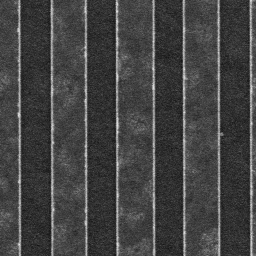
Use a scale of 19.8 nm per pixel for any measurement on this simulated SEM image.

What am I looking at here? one or a few lines or trenches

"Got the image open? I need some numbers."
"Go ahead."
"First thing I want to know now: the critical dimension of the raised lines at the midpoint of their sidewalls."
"0.69 microns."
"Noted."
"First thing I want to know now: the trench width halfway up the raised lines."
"626 nm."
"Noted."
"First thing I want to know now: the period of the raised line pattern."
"1310 nm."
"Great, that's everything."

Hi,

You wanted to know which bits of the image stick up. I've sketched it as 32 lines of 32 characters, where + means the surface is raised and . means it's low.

++.....++++....++++....++++....+
++.....++++....++++....++++....+
++.....++++....++++....++++....+
++.....++++....++++....++++....+
++.....++++....++++....++++....+
++.....++++....++++....++++....+
++.....++++....++++....++++....+
++.....++++....++++....++++....+
++.....++++....++++....++++....+
++.....++++....++++....++++....+
++.....++++....++++....++++....+
++.....++++....++++....++++....+
++.....++++....++++....++++....+
++.....++++....++++....++++....+
++.....++++....++++....++++....+
++.....++++....++++....++++....+
++.....++++....++++....++++....+
++.....++++....++++....++++....+
++.....++++....++++....++++....+
++.....++++....++++....++++....+
++.....++++....++++....++++....+
++.....++++....++++....++++....+
++.....++++....++++....++++....+
++.....++++....++++....++++....+
++.....++++....++++....++++....+
++.....++++....++++....++++....+
++.....++++....++++....++++....+
++.....++++....++++....++++....+
++.....++++....++++....++++....+
++.....++++....++++....++++....+
++.....++++....++++....++++....+
++.....++++....++++....++++....+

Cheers